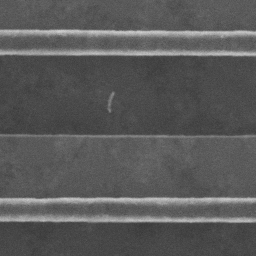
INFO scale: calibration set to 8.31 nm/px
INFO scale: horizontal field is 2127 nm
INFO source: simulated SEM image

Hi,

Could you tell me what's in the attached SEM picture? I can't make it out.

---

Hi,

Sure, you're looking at lines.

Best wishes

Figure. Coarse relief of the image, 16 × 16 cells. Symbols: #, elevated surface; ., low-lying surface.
################
################
################
................
................
................
................
................
######.##.......
################
################
################
################
################
................
................